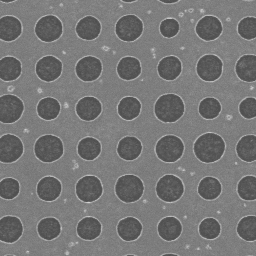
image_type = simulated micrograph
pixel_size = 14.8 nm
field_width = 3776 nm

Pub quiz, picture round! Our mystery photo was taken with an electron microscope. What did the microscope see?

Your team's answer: a regular array of holes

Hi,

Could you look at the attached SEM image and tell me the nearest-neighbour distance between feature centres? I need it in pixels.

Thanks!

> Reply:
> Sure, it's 39.6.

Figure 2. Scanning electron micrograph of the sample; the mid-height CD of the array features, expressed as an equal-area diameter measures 24.7 px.